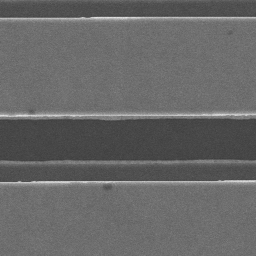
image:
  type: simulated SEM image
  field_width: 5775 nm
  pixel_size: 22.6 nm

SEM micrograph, lines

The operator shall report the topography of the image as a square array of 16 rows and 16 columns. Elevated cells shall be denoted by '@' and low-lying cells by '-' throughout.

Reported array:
----------------
@@@@@@@@@@@@@@@@
@@@@@@@@@@@@@@@@
@@@@@@@@@@@@@@@@
@@@@@@@@@@@@@@@@
@@@@@@@@@@@@@@@@
@@@@@@@@@@@@@@@@
----------------
----------------
----------------
----------------
@@@@@@@@@@@@@@@@
@@@@@@@@@@@@@@@@
@@@@@@@@@@@@@@@@
@@@@@@@@@@@@@@@@
@@@@@@@@@@@@@@@@